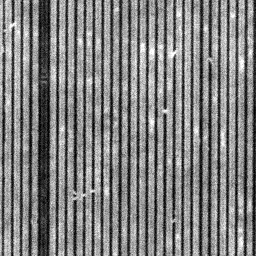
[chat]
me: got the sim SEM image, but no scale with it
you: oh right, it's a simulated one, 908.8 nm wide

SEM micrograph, parallel lines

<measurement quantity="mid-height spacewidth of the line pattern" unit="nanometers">13.8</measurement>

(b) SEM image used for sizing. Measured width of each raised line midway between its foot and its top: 20.4 nanometres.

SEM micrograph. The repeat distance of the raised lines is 31.9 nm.